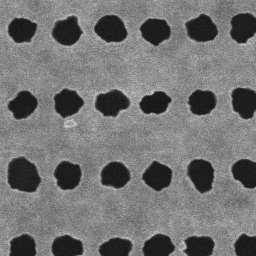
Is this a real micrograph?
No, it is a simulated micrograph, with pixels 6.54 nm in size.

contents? a regular array of holes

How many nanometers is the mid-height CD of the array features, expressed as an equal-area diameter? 180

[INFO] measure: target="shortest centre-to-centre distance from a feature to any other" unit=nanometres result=290